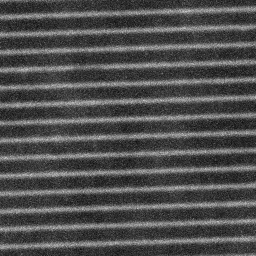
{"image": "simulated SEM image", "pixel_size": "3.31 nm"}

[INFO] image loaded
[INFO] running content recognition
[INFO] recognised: parallel lines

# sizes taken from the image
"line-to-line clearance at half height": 50.8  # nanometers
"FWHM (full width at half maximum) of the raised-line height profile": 9.1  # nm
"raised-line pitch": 58.5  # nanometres